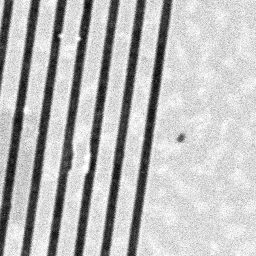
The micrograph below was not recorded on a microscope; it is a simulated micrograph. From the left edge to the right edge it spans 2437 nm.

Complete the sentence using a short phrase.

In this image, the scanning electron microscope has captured parallel lines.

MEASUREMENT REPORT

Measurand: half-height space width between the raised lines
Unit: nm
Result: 80.1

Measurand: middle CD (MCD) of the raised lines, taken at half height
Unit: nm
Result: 168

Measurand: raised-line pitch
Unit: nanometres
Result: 250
